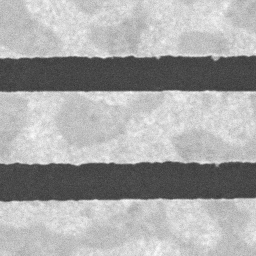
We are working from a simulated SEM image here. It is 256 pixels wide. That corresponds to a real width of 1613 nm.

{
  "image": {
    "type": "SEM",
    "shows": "lines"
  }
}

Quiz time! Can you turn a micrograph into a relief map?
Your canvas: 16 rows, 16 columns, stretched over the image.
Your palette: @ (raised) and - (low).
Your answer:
@@@@@@@@@@@@@@@@
@@@@@@@@@@@@@@@@
@@@@@@@@@@@@@@@@
@@@@@@@@@@-@@@@-
----------------
----------------
@@@@@@@@@@@@@@@@
@@@@@@@@@@@@@@@@
@@@@@@@@@@@@@@@@
@@@@@@@@@@@@@@@@
----------------
----------------
------@@@@@@@@@@
@@@@@@@@@@@@@@@@
@@@@@@@@@@@@@@@@
@@@@@@@@@@@@@@@@